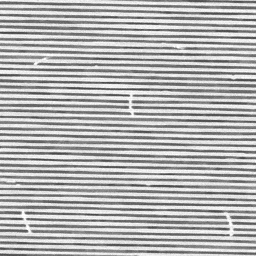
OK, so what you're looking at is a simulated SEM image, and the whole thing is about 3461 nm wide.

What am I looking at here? parallel lines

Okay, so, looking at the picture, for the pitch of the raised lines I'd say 81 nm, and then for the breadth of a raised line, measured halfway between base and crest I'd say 45.6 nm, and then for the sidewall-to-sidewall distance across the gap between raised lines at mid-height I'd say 35.5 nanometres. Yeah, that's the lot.